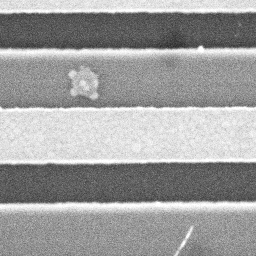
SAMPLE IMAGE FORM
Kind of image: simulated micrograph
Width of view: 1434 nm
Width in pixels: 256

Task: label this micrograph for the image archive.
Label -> lines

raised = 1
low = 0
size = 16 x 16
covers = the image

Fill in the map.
1111111111111111
0000000000000000
0000000000000000
1111111111111111
1111111111111111
1111111111111111
1111111111111111
1111111111111111
1111111111111111
1111111111111111
0000000000000000
0000000000000000
0000000000000000
1111111111111111
1111111111111111
1111111111111111